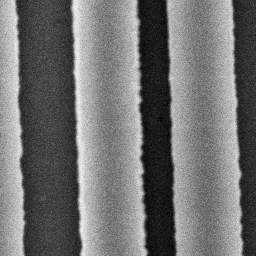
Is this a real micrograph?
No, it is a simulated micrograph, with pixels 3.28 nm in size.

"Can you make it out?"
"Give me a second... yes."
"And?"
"lines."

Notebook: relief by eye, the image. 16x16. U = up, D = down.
UDDDDUUUUDUUUUDD
UDDDDUUUUDDUUUUD
UDDDDUUUUDDUUUUD
UDDDDUUUUDDUUUUD
UDDDDUUUUDDUUUUD
UDDDDUUUUDDUUUUD
UDDDDUUUUDDUUUUD
UDDDDUUUUDDUUUUD
UDDDDUUUUDDUUUUD
UDDDDUUUUDDUUUUD
UDDDDUUUUDDUUUUD
UDDDDUUUUDDUUUUD
UDDDDUUUUDDUUUUD
UDDDDUUUUDDUUUUD
UDDDDUUUUDDUUUUD
UDDDDUUUUDDUUUUD